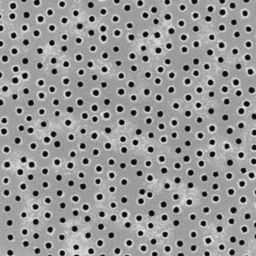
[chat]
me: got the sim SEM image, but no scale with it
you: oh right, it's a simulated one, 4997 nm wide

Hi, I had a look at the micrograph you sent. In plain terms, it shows a regular array of holes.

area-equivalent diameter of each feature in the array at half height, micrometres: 0.115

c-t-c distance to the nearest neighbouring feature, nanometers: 244